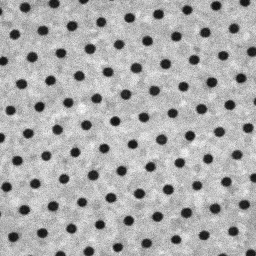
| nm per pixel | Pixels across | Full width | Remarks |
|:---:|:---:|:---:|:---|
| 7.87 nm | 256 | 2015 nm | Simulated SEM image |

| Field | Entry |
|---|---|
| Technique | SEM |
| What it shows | a regular array of holes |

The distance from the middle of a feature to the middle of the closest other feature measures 0.225 microns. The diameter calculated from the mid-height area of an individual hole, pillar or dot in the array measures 82.8 nm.